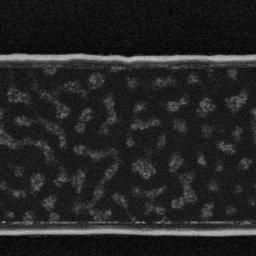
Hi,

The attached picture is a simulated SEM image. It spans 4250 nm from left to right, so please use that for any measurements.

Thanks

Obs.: one or a few lines or trenches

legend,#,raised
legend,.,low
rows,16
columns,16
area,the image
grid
................
................
................
....#...........
################
################
################
################
################
################
################
################
################
################
###.....########
................